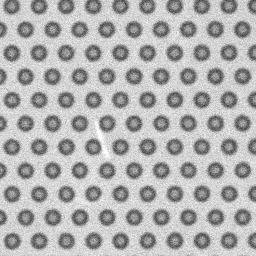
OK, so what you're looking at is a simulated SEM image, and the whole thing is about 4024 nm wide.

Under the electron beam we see an array of small figures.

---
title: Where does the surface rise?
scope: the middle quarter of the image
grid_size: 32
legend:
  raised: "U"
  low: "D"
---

UUUUUUUUUUUUUUUUUUUUUUUUUUUUUUUU
UUUDDUUUUDDDUUUUDDDUUUUDDDUUUUDD
UUDDDDUUUDDDDUUDDDDUUUDDDDUUUDDD
UUDDDDUUUDDDDUUDDDDDUUDDDDUUUDDD
UUDDDDUUUDDDUUUUDDDUUUUDDDUUUDDD
UUUUUUUUUUUUUUUUUUUUUUUUUUUUUUUU
UUUUUUUUUUUUUUUUUUUUUUUUUUUUUUUU
DDUUUUDDDUUUUDDDUUUDDDDUUUDDDUUU
DDDUUDDDDUUUDDDDUUUDDDDUUUDDDDUU
DDDUUDDDDDUUDDDDUUUDDDDUUUDDDDUU
DDUUUUDDDUUUUDDDUUUDDDDUUUDDDUUU
UUUUUUUUUUUUUUUUUUUUUUUUUUUUUUUU
UUUUUUUUUUUUUUUUUUUUUUUUUUUUUUUU
UUDDDDUUUDDDUUUUDDDUUUUDDDUUUDDD
UUDDDDUUUDDDDUUDDDDDUUDDDDUUUDDD
UUDDDDUUUDDDDUUDDDDDUUDDDDUUUDDD
UUDDDUUUUDDDUUUUDDDUUUUDDDUUUUDD
UUUUUUUUUUUUUUUUUUUUUUUUUUUUUUUU
UUUUUUUUUUUUUUUUUUUUUUUUUUUUUUUU
DDUUUUDDDUUUDDDDUUUDDDDUUUDDDUUU
DDDUUDDDDUUUDDDDUUUDDDDUUDDDDDUU
DDDUUDDDDUUUDDDDUUUDDDDUUUDDDDUU
DDUUUUDDDUUUUDDUUUUUDDUUUUDDDUUU
UUUUUUUUUUUUUUUUUUUUUUUUUUUUUUUU
UUUUUUUUUUUUUUUUUDUUUUUUDUUUUUUU
UUDDDDUUUDDDDUUUDDDUUUDDDDUUUDDD
UUDDDDUUUDDDDUUDDDDDUUDDDDDUUDDD
UUDDDDUUUDDDDUUUDDDDUUDDDDUUUDDD
UUUDDUUUUUDDUUUUDDDUUUUDDDUUUUDD
UUUUUUUUUUUUUUUUUUUUUUUUUUUUUUUU
DUUUUUUDUUUUUDDUUUUUDDUUUUUDDUUU
DDUUUDDDDUUUDDDDUUUDDDDUUUDDDDUU